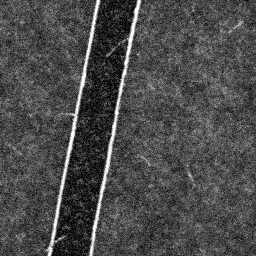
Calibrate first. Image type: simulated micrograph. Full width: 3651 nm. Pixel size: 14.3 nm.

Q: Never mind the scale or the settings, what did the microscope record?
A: one or a few lines or trenches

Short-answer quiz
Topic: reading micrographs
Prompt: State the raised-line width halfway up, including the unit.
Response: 574 nm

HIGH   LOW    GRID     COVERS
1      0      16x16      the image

0000001110000000
0000001100000000
0000001100000000
0000011100000000
0000011100000000
0000011100000000
0000011000000000
0000011000000000
0000011000000000
0000111000000000
0000111000000000
0000110000000000
0000110000000000
0000110000000000
0001110000000000
0001110000000000